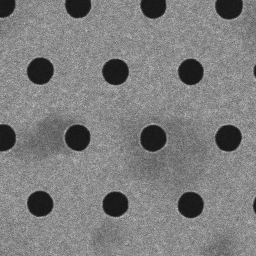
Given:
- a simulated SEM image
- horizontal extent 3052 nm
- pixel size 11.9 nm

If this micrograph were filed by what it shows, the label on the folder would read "a regular array of holes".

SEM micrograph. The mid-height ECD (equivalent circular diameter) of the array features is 320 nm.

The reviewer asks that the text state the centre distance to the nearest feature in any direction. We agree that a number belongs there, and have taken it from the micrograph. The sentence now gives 897 nanometres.